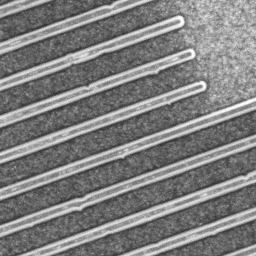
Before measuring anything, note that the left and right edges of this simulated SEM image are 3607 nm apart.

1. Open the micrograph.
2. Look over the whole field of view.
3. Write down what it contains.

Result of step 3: parallel lines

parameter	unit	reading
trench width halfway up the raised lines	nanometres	365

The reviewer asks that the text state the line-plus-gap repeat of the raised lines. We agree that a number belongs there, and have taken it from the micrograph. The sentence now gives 0.484 microns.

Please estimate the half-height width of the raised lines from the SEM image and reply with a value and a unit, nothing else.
118 nanometers